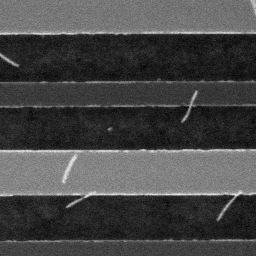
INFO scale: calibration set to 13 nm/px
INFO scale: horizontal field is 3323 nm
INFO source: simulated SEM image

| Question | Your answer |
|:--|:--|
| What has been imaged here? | lines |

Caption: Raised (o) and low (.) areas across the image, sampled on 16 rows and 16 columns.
oooooooooooooooo
oooooooooooooooo
................
................
................
oooooooooooooooo
oooooooooooooooo
................
................
oooooooooooooooo
oooooooooooooooo
oooooooooooooooo
................
................
................
oooooooooooooooo